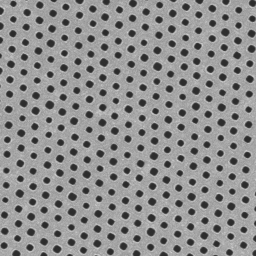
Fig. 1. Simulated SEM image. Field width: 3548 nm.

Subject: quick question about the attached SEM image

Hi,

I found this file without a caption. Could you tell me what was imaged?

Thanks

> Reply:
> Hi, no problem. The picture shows a regular array of holes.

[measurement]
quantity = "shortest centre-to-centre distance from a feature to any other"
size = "202 nm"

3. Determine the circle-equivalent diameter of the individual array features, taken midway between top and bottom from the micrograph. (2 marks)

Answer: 97.7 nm